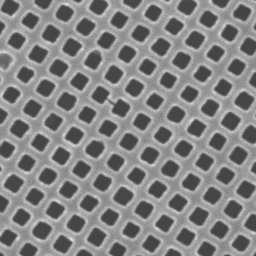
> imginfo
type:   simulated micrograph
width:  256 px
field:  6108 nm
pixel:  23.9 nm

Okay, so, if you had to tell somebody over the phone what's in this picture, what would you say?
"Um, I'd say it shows a regular array of holes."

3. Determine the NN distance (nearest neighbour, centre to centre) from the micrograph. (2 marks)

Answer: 578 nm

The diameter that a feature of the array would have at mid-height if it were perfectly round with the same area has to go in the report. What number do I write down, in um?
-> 0.415